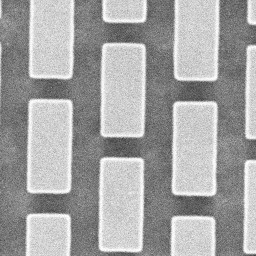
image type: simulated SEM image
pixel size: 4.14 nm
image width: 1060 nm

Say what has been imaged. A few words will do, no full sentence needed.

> groups of lines, slits or small figures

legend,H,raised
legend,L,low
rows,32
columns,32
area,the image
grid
LLLLHHHHHLLLLHHHHHLLLLHHHHHLLLLH
LLLLHHHHHLLLLHHHHHLLLLHHHHHLLLLH
LLLLHHHHHLLLLHHHHHLLLLHHHHHLLLLH
LLLLHHHHHLLLLLLLLLLLLLHHHHHLLLLL
LLLLHHHHHLLLLLLLLLLLLLHHHHHLLLLL
LLLLHHHHHLLLLLLLLLLLLLHHHHHLLLLL
LLLLHHHHHLLLLHHHHHLLLLHHHHHLLLLH
LLLLHHHHHLLLLHHHHHLLLLHHHHHLLLLH
LLLLHHHHHLLLLHHHHHLLLLHHHHHLLLLH
LLLLHHHHHLLLLHHHHHLLLLHHHHHLLLLH
LLLLLLLLLLLLLHHHHHLLLLLLLLLLLLLH
LLLLLLLLLLLLLHHHHHLLLLLLLLLLLLLH
LLLLLLLLLLLLLHHHHHLLLLLLLLLLLLLH
LLLLHHHHHLLLLHHHHHLLLLHHHHHLLLLH
LLLLHHHHHLLLLHHHHHLLLLHHHHHLLLLH
LLLLHHHHHLLLLHHHHHLLLLHHHHHLLLLH
LLLLHHHHHLLLLHHHHHLLLLHHHHHLLLLH
LLLLHHHHHLLLLLLLLLLLLLHHHHHLLLLL
LLLLHHHHHLLLLLLLLLLLLLHHHHHLLLLL
LLLLHHHHHLLLLLLLLLLLLLHHHHHLLLLL
LLLLHHHHHLLLLHHHHHLLLLHHHHHLLLLH
LLLLHHHHHLLLLHHHHHLLLLHHHHHLLLLH
LLLLHHHHHLLLLHHHHHLLLLHHHHHLLLLH
LLLLHHHHHLLLLHHHHHLLLLHHHHHLLLLH
LLLLLLLLLLLLLHHHHHLLLLLLLLLLLLLH
LLLLLLLLLLLLLHHHHHLLLLLLLLLLLLLH
LLLLLLLLLLLLLHHHHHLLLLLLLLLLLLLH
LLLHHHHHHLLLLHHHHHLLLLHHHHHLLLLH
LLLHHHHHHLLLHHHHHHLLLLHHHHHLLLLH
LLLHHHHHHLLLHHHHHHLLLHHHHHHLLLLH
LLLHHHHHHLLLHHHHHHLLLHHHHHHLLLLH
LLLHHHHHHLLLLLLLLLLLLHHHHHHLLLLH